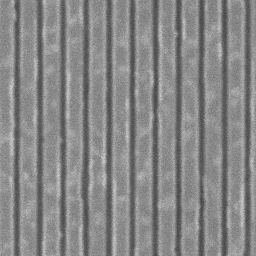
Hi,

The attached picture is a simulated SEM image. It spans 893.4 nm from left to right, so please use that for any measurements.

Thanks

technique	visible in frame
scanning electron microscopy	parallel lines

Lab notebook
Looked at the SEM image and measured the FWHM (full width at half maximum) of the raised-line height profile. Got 55.4 nm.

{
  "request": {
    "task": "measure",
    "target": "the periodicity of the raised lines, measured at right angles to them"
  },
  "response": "80.4 nm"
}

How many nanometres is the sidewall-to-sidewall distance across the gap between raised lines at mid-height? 24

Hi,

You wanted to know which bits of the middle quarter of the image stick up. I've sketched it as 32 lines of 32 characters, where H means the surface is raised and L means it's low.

LHHHHLLHHHLLHHHHLLHHHHLLHHHHLLHH
LHHHHLHHHHLLHHHHLLHHHHLLHHHHLLHH
LHHHHLLHHHLLHHHHLLHHHHLLHHHHLLHH
LHHHHLLHHHLLHHHHLLHHHHLLHHHHLLHH
LHHHHLLHHHLLHHHHLLHHHHLLHHHHLLHH
LHHHHLLHHHLLHHHHLLHHHHLLHHHHLLHH
LHHHHLLHHHLLHHHHLLHHHHLLHHHHLLHH
LHHHHLLHHHLLHHHHLLHHHHLLHHHHLLHH
LHHHHLHHHHLLHHHHLLHHHHLLHHHHLLHH
LHHHHLHHHHLLHHHHLLHHHHLLHHHHLLHH
LHHHHLLHHHLLHHHHLLHHHHLLHHHHLLHH
LHHHHLLHHHLLHHHHLLHHHHLLHHHHLLHH
LHHHHLLHHHLLHHHHLLHHHHLLHHHHLLHH
LHHHHLHHHHLLHHHHLLHHHHLLHHHHLLHH
LHHHHLLHHHLLHHHHLLHHHHLLHHHHLLHH
LHHHHLLHHHLLHHHHLLHHHHLLHHHHLLHH
LHHHHLLHHHLLHHHHLLHHHHLLHHHHLLHH
LHHHHLLHHHLLHHHHLLHHHHLLHHHHLLHH
LHHHHLLHHHLLHHHHLLHHHHLLHHHHLLHH
LHHHHLLHHHLLHHHHLLHHHHLLHHHHLLHH
LHHHHLLHHHLLHHHHLLHHHHLLHHHHLLHH
LHHHHLLHHHLLHHHHLLHHHHLLHHHHLLHH
LHHHHLLHHHLLHHHHLLHHHHLLHHHHLLHH
LHHHHLLHHHLLHHHHLLHHHHLLHHHHLLHH
LHHHHLLHHHLLHHHHLLHHHHLLHHHHLLHH
LHHHHLLHHHLLHHHHLLHHHHLLHHHHLLHH
LHHHHLLHHHLLHHHHLLHHHHLLHHHHLLHH
LHHHLLLHHHLLHHHHLLHHHHLLHHHHLLHH
LHHHLLLHHHLLHHHHLLHHHHLLHHHHLLHH
LHHHLLLHHHLLHHHHLLHHHHLLHHHHLLHH
LHHHLLLHHHLLHHHHLLHHHHLLHHHHLLHH
LHHHLLHHHHLLHHHHLLHHHHLLHHHHLLHH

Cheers